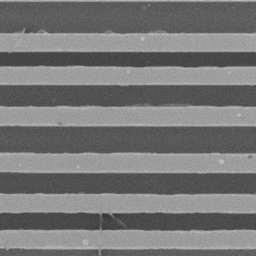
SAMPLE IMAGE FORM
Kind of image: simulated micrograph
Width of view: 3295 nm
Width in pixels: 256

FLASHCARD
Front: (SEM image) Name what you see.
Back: lines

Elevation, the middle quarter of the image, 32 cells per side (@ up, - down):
--------------------------------
@@@@@@@@@@@@@@@@@@@@@@@@@@@@@@@@
@@@@@@@@@@@@@@@@@@@@@@@@@@@@@@@@
@@@@@@@@@@@@@@@@@@@@@@@@@@@@@@@@
@@@@@@@@@@@@@@@@@@@@@@@@@@@@@@@@
--------------------------------
--------------------------------
--------------------------------
--------------------------------
--------------------------------
--------------------------------
@@@@@@@@@@@@@@@@@@@@@@@@@@@@@@@@
@@@@@@@@@@@@@@@@@@@@@@@@@@@@@@@@
@@@@@@@@@@@@@@@@@@@@@@@@@@@@@@@@
@@@@@@@@@@@@@@@@@@@@@@@@@@@@@@@@
--------------------------------
--------------------------------
--------------------------------
--------------------------------
--------------------------------
--------------------------------
--------------------------------
@---@@@@@---@@@@@@@@@@@---------
@@@@@@@@@@@@@@@@@@@@@@@@@@@@@@@@
@@@@@@@@@@@@@@@@@@@@@@@@@@@@@@@@
@@@@@@@@@@@@@@@@@@@@@@@@@@@@@@@@
@@@@@@@@@@@@@@@@@@@@@@@@@@@@@@@@
--------------------------------
--------------------------------
--------------------------------
--------------------------------
--------------------------------